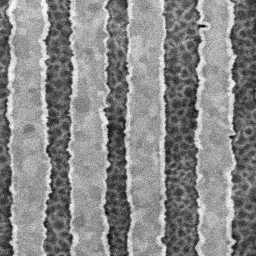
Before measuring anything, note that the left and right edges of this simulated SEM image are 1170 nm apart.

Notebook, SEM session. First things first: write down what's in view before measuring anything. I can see one or a few lines or trenches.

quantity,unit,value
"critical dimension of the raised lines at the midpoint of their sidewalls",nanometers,161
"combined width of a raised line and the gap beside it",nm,285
